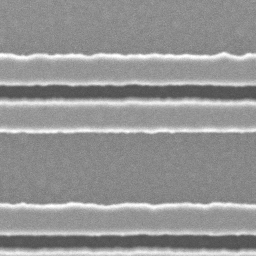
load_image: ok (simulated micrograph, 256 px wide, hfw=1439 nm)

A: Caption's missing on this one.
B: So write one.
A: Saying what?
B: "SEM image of lines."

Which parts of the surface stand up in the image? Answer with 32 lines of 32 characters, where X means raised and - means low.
--------------------------------
--------------------------------
--------------------------------
--------------------------------
--------------------------------
--------------------------------
--------------------------------
XXXXXXXXXXXXXXXXXXXXXXXXXXXXXXXX
XXXXXXXXXXXXXXXXXXXXXXXXXXXXXXXX
XXXXXXXXXXXXXXXXXXXXXXXXXXXXXXXX
XXXXXX-XXXXXXXXX-XXXXXX--XXXXXXX
--------------------------------
----------------X------X--------
XXXXXXXXXXXXXXXXXXXXXXXXXXXXXXXX
XXXXXXXXXXXXXXXXXXXXXXXXXXXXXXXX
XXXXXXXXXXXXXXXXXXXXXXXXXXXXXXXX
-X-XXXX-----------XX------------
--------------------------------
--------------------------------
--------------------------------
--------------------------------
--------------------------------
--------------------------------
--------------------------------
--------------------------------
---------X-----------------X----
XXXXXXXXXXXXXXXXXXXXXXXXXXXXXXXX
XXXXXXXXXXXXXXXXXXXXXXXXXXXXXXXX
XXXXXXXXXXXXXXXXXXXXXXXXXXXXXXXX
--------------------------------
--------------------------------
XXXXXXXXXXXXXXXXXXXXXXXX-X-XX-XX